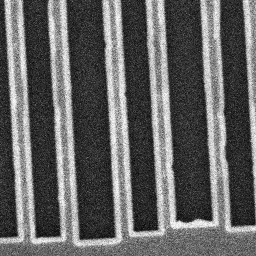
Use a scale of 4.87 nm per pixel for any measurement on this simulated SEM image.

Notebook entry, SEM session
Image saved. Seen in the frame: parallel lines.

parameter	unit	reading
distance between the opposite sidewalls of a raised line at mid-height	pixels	14.6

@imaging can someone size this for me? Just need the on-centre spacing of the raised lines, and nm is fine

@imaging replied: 237